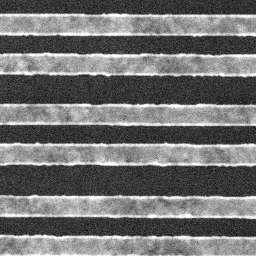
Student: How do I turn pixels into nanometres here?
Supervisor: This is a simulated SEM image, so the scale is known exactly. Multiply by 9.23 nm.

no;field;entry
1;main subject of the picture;lines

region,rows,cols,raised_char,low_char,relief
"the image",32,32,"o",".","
................................
................................
oooooooooooooooooooooooooooooooo
oooooooooooooooooooooooooooooooo
................................
................................
................................
oooooooooooooooooooooooooooooooo
oooooooooooooooooooooooooooooooo
..............................o.
................................
................................
................................
oooooooooooooooooooooooooooooooo
oooooooooooooooooooooooooooooooo
oooooooooooooooooooooooooooooooo
................................
................................
oooooooooooooooooooooooooooooooo
oooooooooooooooooooooooooooooooo
o...oooooo..oooooooooooooooooooo
................................
................................
................................
oo.oo..........o................
oooooooooooooooooooooooooooooooo
oooooooooooooooooooooooooooooooo
................................
................................
oo.ooo..........................
oooooooooooooooooooooooooooooooo
oooooooooooooooooooooooooooooooo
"